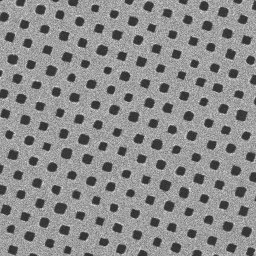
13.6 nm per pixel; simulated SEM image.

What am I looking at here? a regular array of holes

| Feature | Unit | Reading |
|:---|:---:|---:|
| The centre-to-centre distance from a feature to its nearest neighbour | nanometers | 267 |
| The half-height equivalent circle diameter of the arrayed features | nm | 135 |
